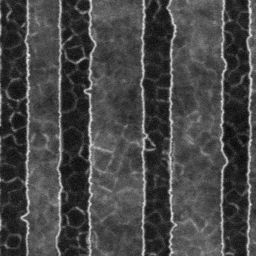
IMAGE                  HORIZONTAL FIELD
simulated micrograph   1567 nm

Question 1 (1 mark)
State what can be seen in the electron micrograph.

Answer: one or a few lines or trenches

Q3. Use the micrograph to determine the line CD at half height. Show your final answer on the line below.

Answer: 175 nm